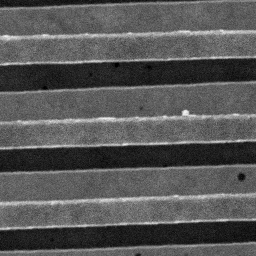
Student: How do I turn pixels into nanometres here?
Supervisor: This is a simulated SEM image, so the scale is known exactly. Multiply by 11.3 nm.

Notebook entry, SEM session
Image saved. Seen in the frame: lines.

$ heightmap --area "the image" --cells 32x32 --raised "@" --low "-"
-----------------@@@@@@@@@@@@@@@
@@@@@@@@@@@@@@@@@@@@@@@@@@@@@@@@
@@@@@@@@@@@@@@@@@@@@@@@@@@@@@@@@
@@@@@@@@@@@@@@@@@@@@@@@@@@@@@@@@
@@@@@@@@@@@@@@@@@@@@@@@@@@@@@@@@
@@@@@@@@@@@@@@@@@@@@@@@@@@@@@@@@
@@@@@@@@@@@@@@@@@@@@@@@@@@@@@@@@
@@@@@@@@@@@@@@@@@@--------------
--------------------------------
--------------------------------
-------------------------@@@@@@@
----@@@@@@@@@@@@@@@@@@@@@@@@@@@@
@@@@@@@@@@@@@@@@@@@@@@@@@@@@@@@@
@@@@@@@@@@@@@@@@@@@@@@@@@@@@@@@@
@@@@@@@@@@@@@@@@@@@@@@@@@@@@@@@@
@@@@@@@@@@@@@@@@@@@@@@@@@@@@@@@@
@@@@@@@@@@@@@@@@@@@@@@@@@@@@@@@@
@@@@@@@@@@@@@@@@@@@@@@@@@@@@@@@@
@@------------------------------
--------------------------------
--------------------------------
-------@@@@@@@@@@@@@@@@@@@@@@@@@
@@@@@@@@@@@@@@@@@@@@@@@@@@@@@@@@
@@@@@@@@@@@@@@@@@@@@@@@@@@@@@@@@
@@@@@@@@@@@@@@@@@@@@@@@@@@@@@@@@
@@@@@@@@@@@@@@@@@@@@@@@@@@@@@@@@
@@@@@@@@@@@@@@@@@@@@@@@@@@@@@@@@
@@@@@@@@@@@@@@@@@@@@@@@@@@@@@---
@@------------------------------
--------------------------------
-----------------------------@@@
--@-@@@@@@@@@@@@@@@@@@@@@@@@@@@@